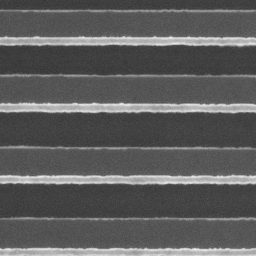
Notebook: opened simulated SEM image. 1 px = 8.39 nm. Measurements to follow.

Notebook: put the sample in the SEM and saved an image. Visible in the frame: lines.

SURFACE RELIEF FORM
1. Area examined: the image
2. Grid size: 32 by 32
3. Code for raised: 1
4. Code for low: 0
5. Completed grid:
00000000000000000000000000000000
11111111111111111111111111111111
11111111111111111111111111111111
11111111111111111111111111111111
11111111111111111111111111111111
11111111111111111111111111111111
00000000000000000000000000000000
00000000000000000000000000000000
00000000000000000000000000000000
11111111111100010000000000000000
11111111111111111111111111111111
11111111111111111111111111111111
11111111111111111111111111111111
11111111111111111111111111111111
00000000000000000000000000000000
00000000000000000000000000000000
00000000000000000000000000000000
00000000000000000000000000000000
11111111111111111111101011000000
11111111111111111111111111111111
11111111111111111111111111111111
11111111111111111111111111111111
11111111111111111111111111111111
00000000000000000000000000000000
00000000000000000000000000000000
00000000000000000000000000000000
00000000000000000000000000000000
11111111111111111111111111111111
11111111111111111111111111111111
11111111111111111111111111111111
11111111111111111111111111111111
11111111111111111111111111111111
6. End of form